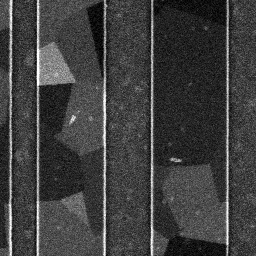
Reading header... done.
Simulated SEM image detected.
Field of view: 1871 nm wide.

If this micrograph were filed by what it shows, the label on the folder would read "one or a few lines or trenches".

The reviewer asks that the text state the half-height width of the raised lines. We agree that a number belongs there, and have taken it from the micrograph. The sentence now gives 524 nm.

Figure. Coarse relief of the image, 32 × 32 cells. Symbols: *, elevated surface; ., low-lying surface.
*....********......*********....
*....********......*********....
*....********......*********....
*....********......*********....
*....********......*********....
*....********......*********....
*....********......*********....
*....********......*********....
*....********......*********....
*....********......*********....
*....********......*********....
*....********......*********....
*....********......*********....
*....********......*********....
*....********......*********....
*....********......*********....
*....********......*********....
*....********......*********....
*....********......*********....
*....********......*********....
*....********......*********....
*....********......*********....
*....********......*********....
*....********......*********....
*....********......*********....
*....********......*********....
*....********......*********....
*....********......*********....
*....********......*********....
*....********......*********....
*....********......*********....
*....********......*********....